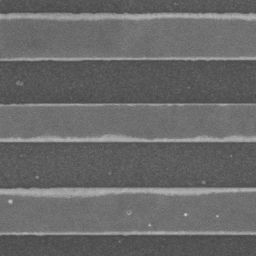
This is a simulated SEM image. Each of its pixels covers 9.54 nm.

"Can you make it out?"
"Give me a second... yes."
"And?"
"lines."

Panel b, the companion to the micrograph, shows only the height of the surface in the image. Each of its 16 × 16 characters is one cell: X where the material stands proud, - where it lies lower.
----------------
XXXXXXXXXXXXXXXX
XXXXXXXXXXXXXXXX
XXXXXXXXXXXXXXXX
----------------
----------------
----------------
XXXXXXXXXXXXXXXX
XXXXXXXXXXXXXXXX
----------------
----------------
----------------
XXXXXXXXXXXXXXXX
XXXXXXXXXXXXXXXX
XXXXXXXXXXXXXXXX
----------------